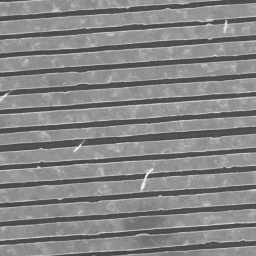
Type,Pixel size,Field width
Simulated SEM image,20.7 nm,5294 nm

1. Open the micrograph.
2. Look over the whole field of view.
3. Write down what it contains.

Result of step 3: parallel lines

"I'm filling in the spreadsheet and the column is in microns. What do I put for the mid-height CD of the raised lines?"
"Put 0.279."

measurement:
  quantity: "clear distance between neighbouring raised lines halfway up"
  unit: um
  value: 0.111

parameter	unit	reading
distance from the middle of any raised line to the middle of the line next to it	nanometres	385